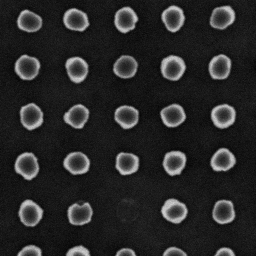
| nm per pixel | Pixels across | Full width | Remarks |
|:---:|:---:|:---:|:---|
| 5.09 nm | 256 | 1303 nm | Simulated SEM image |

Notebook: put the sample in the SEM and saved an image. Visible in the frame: a regular array of raised bodies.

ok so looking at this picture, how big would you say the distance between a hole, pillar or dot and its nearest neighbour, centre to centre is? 0.238 micrometres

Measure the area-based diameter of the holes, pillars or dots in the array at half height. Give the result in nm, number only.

113